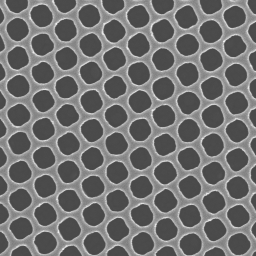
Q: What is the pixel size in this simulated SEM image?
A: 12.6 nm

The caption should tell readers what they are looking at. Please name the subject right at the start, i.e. a regular array of holes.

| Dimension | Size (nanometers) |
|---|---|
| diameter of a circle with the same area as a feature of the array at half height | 275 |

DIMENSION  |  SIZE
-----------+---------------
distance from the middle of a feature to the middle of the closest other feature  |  346 nm